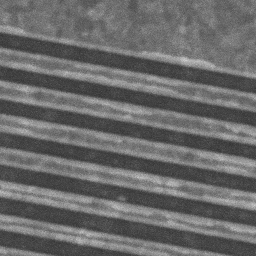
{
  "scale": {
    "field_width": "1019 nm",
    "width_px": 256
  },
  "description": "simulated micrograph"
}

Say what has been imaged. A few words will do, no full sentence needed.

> parallel lines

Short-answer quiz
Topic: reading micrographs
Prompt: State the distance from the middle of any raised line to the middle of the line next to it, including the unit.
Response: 130 nanometers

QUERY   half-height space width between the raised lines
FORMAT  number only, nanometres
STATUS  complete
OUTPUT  76.9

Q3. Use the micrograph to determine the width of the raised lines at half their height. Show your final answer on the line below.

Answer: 51.5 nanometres